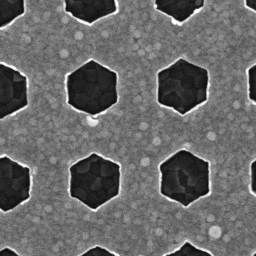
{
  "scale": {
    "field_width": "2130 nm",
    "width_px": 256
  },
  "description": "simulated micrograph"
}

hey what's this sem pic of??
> holes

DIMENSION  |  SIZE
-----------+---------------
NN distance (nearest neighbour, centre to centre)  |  751 nm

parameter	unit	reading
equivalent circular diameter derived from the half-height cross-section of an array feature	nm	429